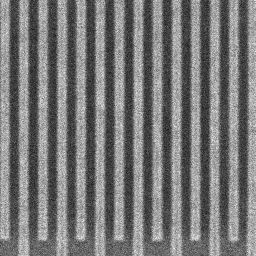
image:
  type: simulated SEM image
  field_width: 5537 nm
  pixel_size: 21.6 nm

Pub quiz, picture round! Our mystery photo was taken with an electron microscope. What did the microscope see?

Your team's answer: parallel lines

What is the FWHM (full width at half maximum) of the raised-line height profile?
9 px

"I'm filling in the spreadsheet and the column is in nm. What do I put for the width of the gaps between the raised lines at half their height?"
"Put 214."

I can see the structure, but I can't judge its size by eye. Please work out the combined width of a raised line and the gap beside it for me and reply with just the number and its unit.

0.413 um